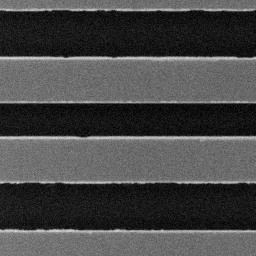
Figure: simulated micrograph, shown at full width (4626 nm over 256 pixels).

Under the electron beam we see lines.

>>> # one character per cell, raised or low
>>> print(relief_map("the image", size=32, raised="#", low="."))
################################
................................
................................
................................
................................
................................
................................
################################
################################
################################
################################
################################
################################
................................
................................
................................
................................
################################
################################
################################
################################
################################
################################
................................
................................
................................
................................
................................
................................
################################
################################
################################